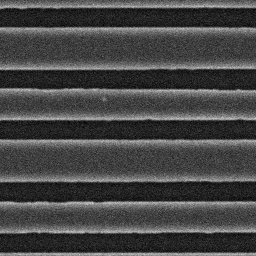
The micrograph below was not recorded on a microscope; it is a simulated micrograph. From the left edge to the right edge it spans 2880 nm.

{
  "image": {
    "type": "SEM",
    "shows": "lines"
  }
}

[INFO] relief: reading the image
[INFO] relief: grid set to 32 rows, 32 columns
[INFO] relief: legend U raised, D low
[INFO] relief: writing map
UUUUUUUUUUUUUUUUUUUUUUUUUUUUUUUU
DDDDDDDDDDDDDDDDDDDDDDDDDDDDDDDD
DDDDDDDDDDDDDDDDDDDDDDDDDDDDDDDD
UDDDDDDDDDDDDDDDUUDUDDUUDDDUDDDD
UUUUUUUUUUUUUUUUUUUUUUUUUUUUUUUU
UUUUUUUUUUUUUUUUUUUUUUUUUUUUUUUU
UUUUUUUUUUUUUUUUUUUUUUUUUUUUUUUU
UUUUUUUUUUUUUUUUUUUUUUUUUUUUUUUU
UUUUUUUUUUUUUUUUUUUUUUUUUUUUUUDU
DDDDDDDDDDDDDDDDDDDDDDDDDDDDDDDD
DDDDDDDDDDDDDDDDDDDDDDDDDDDDDDDD
UUUUUUUUUUUUUUUUUUUUUUUUUUUUUUUU
UUUUUUUUUUUUUUUUUUUUUUUUUUUUUUUU
UUUUUUUUUUUUUUUUUUUUUUUUUUUUUUUU
UUUUUUUUUUUUUUUUUUUUUUUUUUUUUUUU
DDDDDDDDDDDDDDDDDDDDDDDDDDDDDDDD
DDDDDDDDDDDDDDDDDDDDDDDDDDDDDDDD
DDDDDDDDDDDDDDDDDDDDDDDDDDDDDDDD
UUUUUUUUUUUUUUUUUUUUUUUUUUUUUUUU
UUUUUUUUUUUUUUUUUUUUUUUUUUUUUUUU
UUUUUUUUUUUUUUUUUUUUUUUUUUUUUUUU
UUUUUUUUUUUUUUUUUUUUUUUUUUUUUUUU
UUUUUUUUUUUUUUUUUUUUUUUUUUUUUUUU
DDDDDDDDDDDDDDDDDDDDDDDDDDDDDDDD
DDDDDDDDDDDDDDDDDDDDDDDDDDDDDDDD
UUUUUUUUUUUUUUUUUUUUUUUUUUUUUUUU
UUUUUUUUUUUUUUUUUUUUUUUUUUUUUUUU
UUUUUUUUUUUUUUUUUUUUUUUUUUUUUUUU
UUUUUUUUUUUUUUUUUUUUUUUUUUUUUUUU
DDDDDDDDDDDDDDDDDDDDDDDDDDDDDDDD
DDDDDDDDDDDDDDDDDDDDDDDDDDDDDDDD
DDDDDDDDDDDDDDDDDDDDDDDDDDDDDDDD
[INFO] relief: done